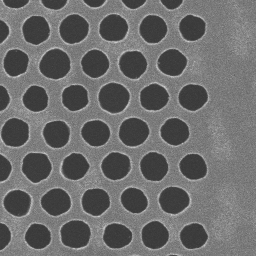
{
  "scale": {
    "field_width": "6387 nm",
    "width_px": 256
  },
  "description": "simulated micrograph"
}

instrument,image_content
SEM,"a regular array of holes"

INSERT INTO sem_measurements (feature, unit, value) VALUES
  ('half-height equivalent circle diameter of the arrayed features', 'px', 27.8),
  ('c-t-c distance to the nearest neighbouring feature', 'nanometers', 955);